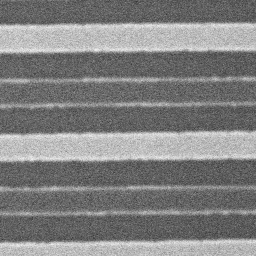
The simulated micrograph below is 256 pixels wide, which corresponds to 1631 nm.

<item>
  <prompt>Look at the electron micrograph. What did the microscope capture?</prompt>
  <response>lines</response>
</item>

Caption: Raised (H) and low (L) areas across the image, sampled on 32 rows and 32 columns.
LLLLLLLLLLLLLLLLLLLLLLLLLLLLLLLL
LLLLLLLLLLLLLLLLLLLLLLLLLLLLLLLL
LLLLLLLLLLLLLLLLLLLLLLLLLLLLLLLL
HHHHHHHHHHHHHHHHHHHHHHHHHHHHHHHH
HHHHHHHHHHHHHHHHHHHHHHHHHHHHHHHH
HHHHHHHHHHHHHHHHHHHHHHHHHHHHHHHH
LLLLLLLLLLLLLLLLLLLLLLLLLLLLLLLL
LLLLLLLLLLLLLLLLLLLLLLLLLLLLLLLL
LLLLLLLLLLLLLLLLLLLLLLLLLLLLLLLL
LLLLLLLLLLLLLLLLLLLLLLLLLLLLLLLL
HHHHHHHHHHHHHHHHHHHHHHHHHHHHHHHH
HHHHHHHHHHHHHHHHHHHHHHHHHHHHHHHH
HHHHHHHHHHHHHHHHHHHHHHHHHHHHHHHH
LLLLLLLLLLLLLLLLLLLLLLLLLLLLLLLL
LLLLLLLLLLLLLLLLLLLLLLLLLLLLLLLL
LLLLLLLLLLLLLLLLLLLLLLLLLLLLLLLL
LLLLLLLLLLLLLLLLLLLLLLLLLLLLLLLL
HHHHHHHHHHHHHHHHHHHHHHHHHHHHHHHH
HHHHHHHHHHHHHHHHHHHHHHHHHHHHHHHH
HHHHHHHHHHHHHHHHHHHHHHHHHHHHHHHH
LLLLLLLLLLLLLLLLLLLLLLLLLLLLLLLL
LLLLLLLLLLLLLLLLLLLLLLLLLLLLLLLL
LLLLLLLLLLLLLLLLLLLLLLLLLLLLLLLL
LLLLLLLLLLLLLLLLHHHHHHHHHHHHHHHH
HHHHHHHHHHHHHHHHHHHHHHHHHHHHHHHH
HHHHHHHHHHHHHHHHHHHHHHHHHHHHHHHH
HHHHHHHHHHHHHHHHHHHHHHHHHHHHHHHH
LLLLLLLLLLLLLLLLLLLLLLLLLLLLLLLL
LLLLLLLLLLLLLLLLLLLLLLLLLLLLLLLL
LLLLLLLLLLLLLLLLLLLLLLLLLLLLLLLL
LLLLLHHHHHHHHHHHHHHHHHHHHHHHHHHH
HHHHHHHHHHHHHHHHHHHHHHHHHHHHHHHH